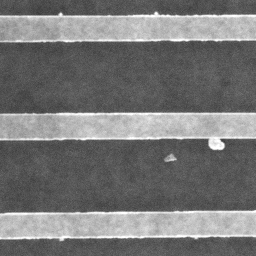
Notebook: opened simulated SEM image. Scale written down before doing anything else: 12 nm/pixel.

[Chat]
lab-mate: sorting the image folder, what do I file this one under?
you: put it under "lines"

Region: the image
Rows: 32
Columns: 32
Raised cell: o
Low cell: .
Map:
................................
................................
oooooooooooooooooooooooooooooooo
oooooooooooooooooooooooooooooooo
oooooooooooooooooooooooooooooooo
................................
................................
................................
................................
................................
................................
................................
................................
................................
oooooooooooooooooooooooooooooooo
oooooooooooooooooooooooooooooooo
oooooooooooooooooooooooooooooooo
..........................o.....
................................
................................
................................
................................
................................
................................
................................
................................
.....................ooooooooooo
oooooooooooooooooooooooooooooooo
oooooooooooooooooooooooooooooooo
ooooooooooooooooooooooooooooo..o
................................
................................